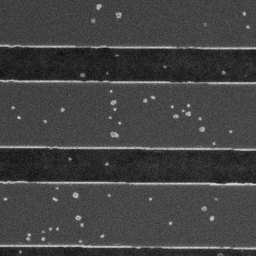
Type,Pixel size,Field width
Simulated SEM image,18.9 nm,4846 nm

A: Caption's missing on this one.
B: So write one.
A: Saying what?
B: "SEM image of lines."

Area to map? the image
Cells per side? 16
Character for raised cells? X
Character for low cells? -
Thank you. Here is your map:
XXXXXXXXXXXXXXXX
XXXXXXXXXXXXXXXX
XXXXXXXXXXXXXXXX
----------------
----------------
XXXXXXXXXXXXXXXX
XXXXXXXXXXXXXXXX
XXXXXXXXXXXXXXXX
XXXXXXXXXXXXXXXX
----------------
----------------
XXXXXXXXXXXXXX--
XXXXXXXXXXXXXXXX
XXXXXXXXXXXXXXXX
XXXXXXXXXXXXXXXX
----------------